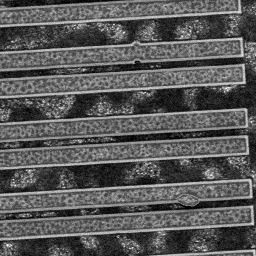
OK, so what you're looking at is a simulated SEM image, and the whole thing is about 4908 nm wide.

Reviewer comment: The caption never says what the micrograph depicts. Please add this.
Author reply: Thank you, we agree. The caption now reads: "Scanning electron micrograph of parallel lines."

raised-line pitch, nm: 664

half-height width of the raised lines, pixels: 16.8